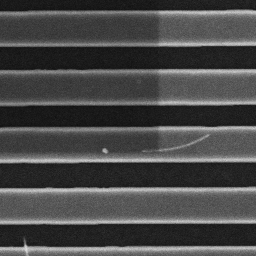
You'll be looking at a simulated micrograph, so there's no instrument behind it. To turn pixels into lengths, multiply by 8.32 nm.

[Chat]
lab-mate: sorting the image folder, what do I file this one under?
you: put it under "lines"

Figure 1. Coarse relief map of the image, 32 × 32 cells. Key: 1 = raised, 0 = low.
00000000000000000000000000000000
11111111111111111111111111111111
11111111111111111111111111111111
11111111111111111111111111111111
11111111111111111111111111111111
11111111111111111111111111111111
00000000000000000000000000000000
00000000000000000000000000000000
00000000000000000000000000000000
11111111111111111111111111111111
11111111111111111111111111111111
11111111111111111111111111111111
11111111111111111111111111111111
00000000000000000000000000000000
00000000000000000000000000000000
00000000000000000000000000000000
11111111111111111111111111111111
11111111111111111111111111111111
11111111111111111111111111111111
11111111111111111111111111111111
00000000000000000000000000000000
00000000000000000000000000000000
00000000000000000000000000000000
00000000000000011111111111111111
11111111111111111111111111111111
11111111111111111111111111111111
11111111111111111111111111111111
11111111111111111111111111111111
00000000000000000000000000000000
00000000000000000000000000000000
00000000000000000000000000000000
11111111111111111111111111111111